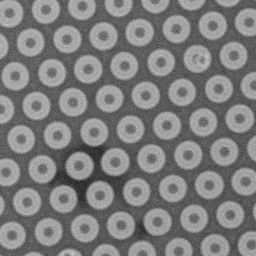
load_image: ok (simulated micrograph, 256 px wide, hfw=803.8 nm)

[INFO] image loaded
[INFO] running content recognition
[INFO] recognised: an array of small figures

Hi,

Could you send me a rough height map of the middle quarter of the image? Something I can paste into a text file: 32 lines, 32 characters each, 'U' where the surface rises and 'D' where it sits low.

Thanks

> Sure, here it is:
DDDUUUUUUDDDUUUUUUDDDUUUUUUUDDUU
DDDUUUUUUDDDUUUUUUDDDDUUUUUDDDDU
DDDUUUUUUDDDUUUUUUDDDDUUUUDDDDDD
DDDUUUUUUDDDDUUUUDDDDDDDDDDDDDDD
DDDDDUUDDDDDDDDDDDDDDDDDDDDUUUUU
DDDDDDDDDDUUDDDDDDUUUUUDDDDUUUUU
DUUUDDDDDUUUUUDDDUUUUUUUDDUUUUUU
UUUUUDDDUUUUUUUDDUUUUUUUDDUUUUUU
UUUUUUDDUUUUUUUDDUUUUUUUDDUUUUUU
UUUUUUDDUUUUUUUDDUUUUUUDDDDUUUUU
UUUUUUDDUUUUUUDDDDUUUUUDDDDDDDDD
UUUUUDDDDUUUUDDDDDDDDDDDDDDDDDDD
UUUUDDDDDDDDDDDDDDDDDDDDUUUDDDDD
DDDDDDDDDDDDDDDUUUUDDDDUUUUUUDDD
DDDDDUUUUUDDDDUUUUUUDDDUUUUUUDDU
UDDDDUUUUUUDDUUUUUUUDDUUUUUUUDDD
UDDDUUUUUUUDDUUUUUUUDDUUUUUUUDDD
UUDDUUUUUUUDDUUUUUUUDDDUUUUUUDDD
UUDDUUUUUUUDDDUUUUUDDDDDUUUDDDDD
UDDDDUUUUUDDDDDUUUDDDDDDDDDDDDUU
DDDDDDDDDDDDDDDDDDDDUUUDDDDDDUUU
DDDDDDDDDDDUUUUDDDDUUUUUDDDDUUUU
DDUUUUDDDDUUUUUUDDDUUUUUUDDDUUUU
DUUUUUUDDDUUUUUUDDUUUUUUUDDDUUUU
DUUUUUUDDUUUUUUUDDUUUUUUUDDDUUUU
DUUUUUUDDUUUUUUUDDDUUUUUUDDDDUUU
DUUUUUUDDDUUUUUUDDDDUUUUDDDDDDDD
DUUUUUUDDDDUUUDDDDDDDDDDDDDDDDDD
DDUUUUDDDDDDDDDDDDDDDDDDDUUUUDDD
DDDDDDDDUUDDDDDDUUUUDDDDUUUUUUDD
UDDDDDUUUUUUDDDUUUUUUDDDUUUUUUDD
UUUDDDUUUUUUDDDUUUUUUDDDUUUUUUUD